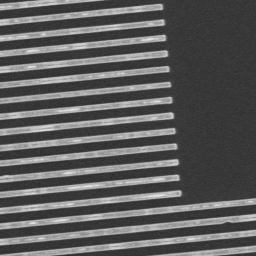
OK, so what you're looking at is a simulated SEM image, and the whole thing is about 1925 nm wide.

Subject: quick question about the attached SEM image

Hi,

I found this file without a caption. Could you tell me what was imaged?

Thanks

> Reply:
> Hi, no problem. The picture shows parallel lines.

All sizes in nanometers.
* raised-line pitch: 118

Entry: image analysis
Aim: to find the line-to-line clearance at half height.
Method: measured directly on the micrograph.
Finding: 75.8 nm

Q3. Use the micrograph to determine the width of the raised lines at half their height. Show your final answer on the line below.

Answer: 5.97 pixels